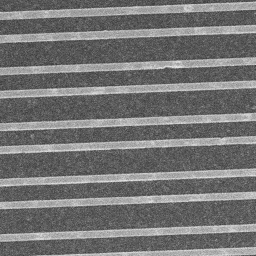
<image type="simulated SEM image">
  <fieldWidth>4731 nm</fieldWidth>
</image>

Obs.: parallel lines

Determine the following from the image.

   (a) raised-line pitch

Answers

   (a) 512 nm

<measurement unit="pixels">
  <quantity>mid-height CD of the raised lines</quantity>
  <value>6.87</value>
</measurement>